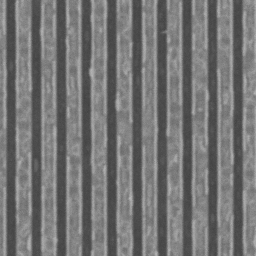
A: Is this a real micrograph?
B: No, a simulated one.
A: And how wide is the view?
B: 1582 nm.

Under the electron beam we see parallel lines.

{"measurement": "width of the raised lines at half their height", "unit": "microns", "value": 0.0973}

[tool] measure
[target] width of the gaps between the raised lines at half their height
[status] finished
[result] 59.5 nm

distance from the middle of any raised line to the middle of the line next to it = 156 nanometers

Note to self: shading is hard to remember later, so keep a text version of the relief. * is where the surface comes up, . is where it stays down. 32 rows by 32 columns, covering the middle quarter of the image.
.***...****..****...***...***...
.***..*****..****...***...***...
.***..*****..****...***...***...
.***...****..****...***...***...
.***...****..****...***...***...
.***...****..****...***...****..
.***...****..****...***...****..
.***...****..****...***...****..
.***...****..****...***...****..
.***...****..****...***...****..
.***...****..****...***...****..
.***...****..****...***...****..
.***...****..****...***...***...
.***...****..****...***...***...
.***...****..****...***...***...
.***...****..****...***...***...
.***...****..****...***...***...
.***...****..****...***...****..
.***...****..****...***...****..
.***...****..****...***...****..
.***...****..****...***...****..
.***...****..****...***...****..
.***...****..****...***...****..
.***...****..****...***...****..
.***...****..****...***...****..
.***...****..****...***...****..
.***...****..****...***...****..
.***...****..****...***...****..
.***...****..****...***...****..
.***...****..****...***...****..
.***...****..****...***...****..
.***...****..****...***...****..